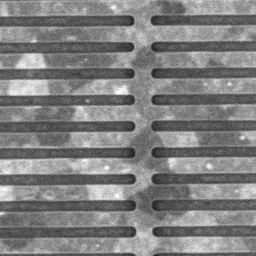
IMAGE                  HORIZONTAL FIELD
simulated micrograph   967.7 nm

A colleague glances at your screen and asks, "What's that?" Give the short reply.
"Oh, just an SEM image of groups of lines, slits or small figures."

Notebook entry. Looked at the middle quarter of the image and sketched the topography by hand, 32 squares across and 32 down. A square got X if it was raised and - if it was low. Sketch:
XXXXXXXXXXXXXXXXXXXXXXXXXXXXXXXX
-----------------XXXXX----------
------------------XXXX----------
-----------------XXXXXX---------
XXXXXXXXXXXXXXXXXXXXXXXXXXXXXXXX
XXXXXXXXXXXXXXXXXXXXXXXXXXXXXXXX
XXXXXXXXXXXXXXXXXXXXXXXXXXXXXXXX
----------------XXXXXXX---------
------------------XXXX----------
------------------XXXX----------
---XXX-----XXXXXXXXXXXXXXXXXXXXX
XXXXXXXXXXXXXXXXXXXXXXXXXXXXXXXX
XXXXXXXXXXXXXXXXXXXXXXXXXXXXXXXX
XXXXXXXXXXXXXXXXXXXXXXXXXXXXXXXX
-----------------XXXXX----------
------------------XXX-----------
-----------------XXXXX----------
XXXXXXXXXXXXXXXXXXXXXXXXXXXXXXXX
XXXXXXXXXXXXXXXXXXXXXXXXXXXXXXXX
XXXXXXXXXXXXXXXXXXXXXXXXXXXXXXXX
XXXXXXXXXXXXXXXXXXXXXXXXXXXXXXXX
------------------XXXX----------
------------------XXXX----------
-----------------XXXXXX---------
XXXXXXXXXXXXXXXXXXXXXXXXXXXXXXXX
XXXXXXXXXXXXXXXXXXXXXXXXXXXXXXXX
XXXXXXXXXXXXXXXXXXXXXXXXXXXXXXXX
-----------------XXXXX----------
------------------XXXX----------
------------------XXXX----------
XXXXXXXXXXXXXXXXXXXXXXXXXXXXXXXX
XXXXXXXXXXXXXXXXXXXXXXXXXXXXXXXX